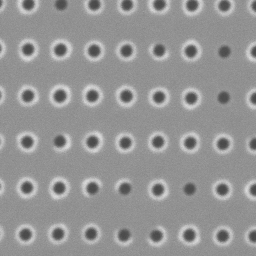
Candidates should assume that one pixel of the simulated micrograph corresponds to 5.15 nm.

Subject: a regular array of holes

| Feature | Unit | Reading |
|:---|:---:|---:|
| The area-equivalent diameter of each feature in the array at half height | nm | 68.5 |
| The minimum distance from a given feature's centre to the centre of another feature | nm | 167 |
